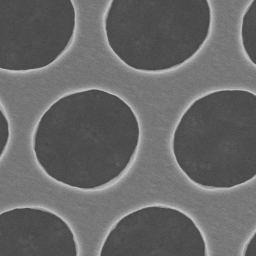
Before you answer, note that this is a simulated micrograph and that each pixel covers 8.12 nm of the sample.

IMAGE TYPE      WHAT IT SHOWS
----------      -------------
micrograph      holes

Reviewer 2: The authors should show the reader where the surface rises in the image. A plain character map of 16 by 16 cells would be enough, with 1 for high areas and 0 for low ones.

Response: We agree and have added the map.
0000011000000110
0000011000000110
0000111000000110
0000111000001111
1111111111111111
1111111111111111
1110000011110000
1110000001100000
0100000001100000
1100000011100000
1110000011100000
1111000111110001
1111111111111111
0000111100001111
0000111000001111
0000010000000110